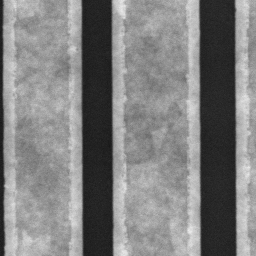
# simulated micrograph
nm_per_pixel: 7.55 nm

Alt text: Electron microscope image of one or a few lines or trenches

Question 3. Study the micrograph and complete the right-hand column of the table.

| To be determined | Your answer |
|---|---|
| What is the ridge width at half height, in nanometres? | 533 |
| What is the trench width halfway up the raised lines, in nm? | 341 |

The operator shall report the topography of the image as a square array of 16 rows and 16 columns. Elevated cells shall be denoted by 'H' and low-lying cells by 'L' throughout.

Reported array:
LHHHHLLHHHHHLLLH
LHHHHLLHHHHHLLLH
LHHHHLLHHHHHLLLH
LHHHHLLHHHHHLLLH
LHHHHLLHHHHHLLLH
LHHHHLLHHHHHLLLH
LHHHHLLHHHHHLLLH
LHHHHLLHHHHHLLLH
LHHHHLLHHHHHLLLH
LHHHHLLHHHHHLLLH
LHHHHLLHHHHHLLLH
LHHHHLLHHHHHLLLH
LHHHHLLHHHHHLLLH
LHHHHLLHHHHHLLLH
LHHHHLLHHHHHLLLH
LHHHHLLHHHHHLLLH